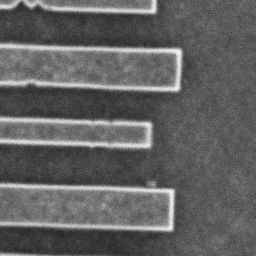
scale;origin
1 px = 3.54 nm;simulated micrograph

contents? one or a few lines or trenches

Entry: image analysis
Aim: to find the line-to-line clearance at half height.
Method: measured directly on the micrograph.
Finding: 137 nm